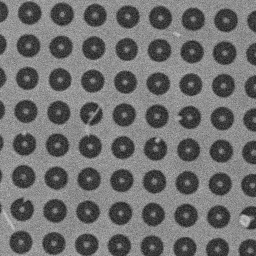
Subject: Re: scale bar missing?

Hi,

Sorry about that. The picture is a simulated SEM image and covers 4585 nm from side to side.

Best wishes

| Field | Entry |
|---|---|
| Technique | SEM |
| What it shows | an array of small figures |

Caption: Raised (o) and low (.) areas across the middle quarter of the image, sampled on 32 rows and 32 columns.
oooooooooooooooooooooooooooooooo
.ooooo...oooooo.oooooooooooooooo
..ooo.....ooo.....oooo...ooooo..
..oo......oo......ooo.....ooo...
..oo......oo......oo.......oo...
..oo......oo......ooo......oo...
.oooo....oooo.....ooo.....ooo...
ooooooooooooooo.oooooo...ooooo..
oooooooooooooooooooooooooooooooo
oooooo..oooooooooooooooooooooooo
.ooo.....oooo....ooooo...oooooo.
..oo......oo......ooo.....ooo...
..oo......oo......oo......ooo...
.ooo......oo......oo......ooo...
.oooo....oooo....oooo.....ooo...
oooooooooooooo..oooooo...oooo...
oooooooooooooooooooooooooooooooo
oooooooooooooooooooooooooooooooo
.ooo.....oooo...oooooo.oooooooo.
.ooo.....ooo.....ooo...o.oooo...
.oo.......oo......oo......oo....
.ooo.....ooo......oo......oo....
oooo.....ooo.....ooo......oo....
oooooo..ooooo...ooooo....oooo...
oooooooooooooooooooooooooooooo.o
oooooooooooooooooooooooooooooooo
oooo....ooooo...oooooo..oooooooo
.ooo.....ooo.....ooo.....oooo...
.oo......ooo.....ooo.....ooo....
.oo......oo......ooo......oo....
oooo.....ooo.....ooo.....ooo....
ooooo...ooooo...ooooo....ooo....